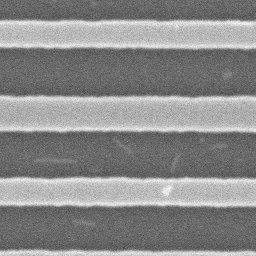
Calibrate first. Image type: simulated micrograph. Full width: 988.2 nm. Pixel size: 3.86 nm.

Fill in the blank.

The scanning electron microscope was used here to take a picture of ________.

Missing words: lines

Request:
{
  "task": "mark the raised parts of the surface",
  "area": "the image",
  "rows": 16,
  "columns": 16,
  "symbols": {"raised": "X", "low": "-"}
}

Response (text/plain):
----------------
XXXXXXXXXXXXXXXX
XXXXXXXXXXXXXXXX
----------------
----------------
----------------
XXXXXXXXXXXXXXXX
XXXXXXXXXXXXXXXX
----------------
----------------
----------------
XXXXXXXXXXXXXXXX
XXXXXXXXXXXXXXXX
----------------
----------------
----------------